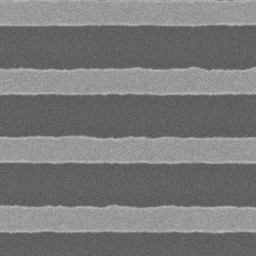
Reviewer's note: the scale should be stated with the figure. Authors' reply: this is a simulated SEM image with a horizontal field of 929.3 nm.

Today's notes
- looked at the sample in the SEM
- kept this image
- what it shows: lines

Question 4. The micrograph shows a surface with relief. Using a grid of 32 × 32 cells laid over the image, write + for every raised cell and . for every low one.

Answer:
++++++++++++++++++++++++++++++++
++++++++++++++++++++++++++++++++
++++++++++++++++++++++++++++++++
................................
................................
................................
................................
................................
........................+.......
++++++++++++++++++++++++++++++++
++++++++++++++++++++++++++++++++
++++++++++++++++++++++++++++++++
................................
................................
................................
................................
................................
++++++++++++++++++++++++++++++++
++++++++++++++++++++++++++++++++
++++++++++++++++++++++++++++++++
................................
................................
................................
................................
................................
................................
++++++++++++++++++++++++++++++++
++++++++++++++++++++++++++++++++
++++++++++++++++++++++++++++++++
................................
................................
................................